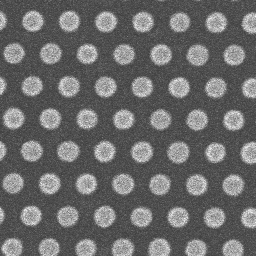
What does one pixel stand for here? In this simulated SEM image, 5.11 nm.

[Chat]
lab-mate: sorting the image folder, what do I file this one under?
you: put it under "a regular array of raised bodies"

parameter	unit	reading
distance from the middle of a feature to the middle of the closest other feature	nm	187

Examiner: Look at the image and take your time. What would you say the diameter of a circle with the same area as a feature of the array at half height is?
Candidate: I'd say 104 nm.